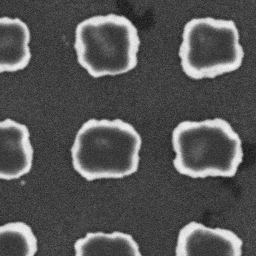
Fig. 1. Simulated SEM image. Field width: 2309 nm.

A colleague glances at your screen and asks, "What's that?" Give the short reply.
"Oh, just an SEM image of raised bodies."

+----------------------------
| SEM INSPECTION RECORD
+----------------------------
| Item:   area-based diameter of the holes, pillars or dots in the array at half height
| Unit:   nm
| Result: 550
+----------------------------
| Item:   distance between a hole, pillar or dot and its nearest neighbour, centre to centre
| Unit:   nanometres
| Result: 907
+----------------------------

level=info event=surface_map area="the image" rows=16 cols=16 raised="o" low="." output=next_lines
................
o....ooo....oo..
oo...ooo....ooo.
oo...ooo...oooo.
......oo....oo..
................
................
................
oo...oooo..oooo.
oo...oooo..oooo.
oo...ooo...oooo.
................
................
................
oo..........oo..
oo...ooo...oooo.